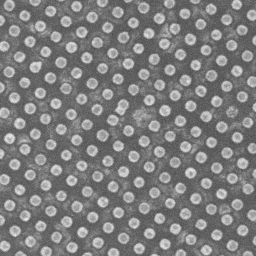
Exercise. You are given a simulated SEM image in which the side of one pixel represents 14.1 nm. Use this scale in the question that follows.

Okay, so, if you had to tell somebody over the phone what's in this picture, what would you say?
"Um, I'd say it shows a regular array of raised bodies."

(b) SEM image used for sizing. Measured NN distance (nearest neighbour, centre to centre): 257 nm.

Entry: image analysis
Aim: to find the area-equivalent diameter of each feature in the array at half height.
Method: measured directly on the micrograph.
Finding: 0.138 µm